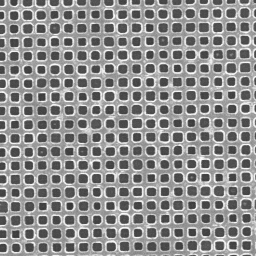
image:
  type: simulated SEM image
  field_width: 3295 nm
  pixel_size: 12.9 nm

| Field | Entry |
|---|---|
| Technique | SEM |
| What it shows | a regular array of holes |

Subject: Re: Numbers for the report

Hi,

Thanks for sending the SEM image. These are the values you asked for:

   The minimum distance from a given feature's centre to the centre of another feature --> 170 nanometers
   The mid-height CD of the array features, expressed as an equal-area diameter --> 128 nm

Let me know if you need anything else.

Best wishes